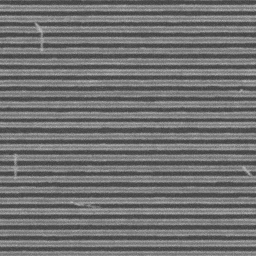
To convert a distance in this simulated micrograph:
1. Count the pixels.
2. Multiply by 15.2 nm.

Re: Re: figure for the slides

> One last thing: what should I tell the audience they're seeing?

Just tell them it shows parallel lines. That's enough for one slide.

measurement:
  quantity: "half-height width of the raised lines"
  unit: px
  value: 4.5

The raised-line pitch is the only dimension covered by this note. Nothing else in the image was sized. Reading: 0.163 microns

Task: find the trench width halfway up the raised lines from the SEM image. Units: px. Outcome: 6.12